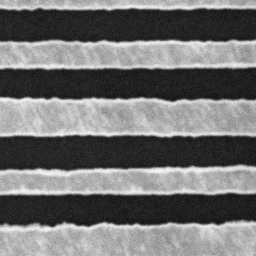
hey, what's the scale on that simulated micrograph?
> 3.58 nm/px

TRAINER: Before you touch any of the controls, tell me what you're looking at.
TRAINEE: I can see lines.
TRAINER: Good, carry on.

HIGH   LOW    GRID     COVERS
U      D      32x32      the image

UUUUUUUUUUUUUUUUUUUUUUUUUUUUUUUU
DDDDDDDDDDDDDDDDDDDDDDDDDDDDDDDD
DDDDDDDDDDDDDDDDDDDDDDDDDDDDDDDD
DDDDDDDDDDDDDDDDDDDDDDDDDDDDDDDD
DDDDDDDDDDDDDDDDDDDDDDDDDDDDDDDD
UUUUUUUUUUUUUUUUUUUUUUUUUUUUUUUU
UUUUUUUUUUUUUUUUUUUUUUUUUUUUUUUU
UUUUUUUUUUUUUUUUUUUUUUUUUUUUUUUU
DDDDDDDDDDDDDDDDDDDDDDDDDDDDDDDD
DDDDDDDDDDDDDDDDDDDDDDDDDDDDDDDD
DDDDDDDDDDDDDDDDDDDDDDDDDDDDDDDD
DDDDDDDDDDDDDDDDDDDDDDDDDDDDDDDD
UUUUUUUUUUUUUUUUUUUUDDUUUUUDUDUD
UUUUUUUUUUUUUUUUUUUUUUUUUUUUUUUU
UUUUUUUUUUUUUUUUUUUUUUUUUUUUUUUU
UUUUUUUUUUUUUUUUUUUUUUUUUUUUUUUU
UUUUUUUUUUUUUUUUUUUUUUUUUUUUUUUU
DDDDDDDDDDDDDDDDDDDDDDDDDDDDDDDD
DDDDDDDDDDDDDDDDDDDDDDDDDDDDDDDD
DDDDDDDDDDDDDDDDDDDDDDDDDDDDDDDD
DDDDDDDDDDDDDDDDDDDDDDDDDDDDDDDD
UUUUUUUUDUUUUUUUUUUUUUUUUUUUUUUU
UUUUUUUUUUUUUUUUUUUUUUUUUUUUUUUU
UUUUUUUUUUUUUUUUUUUUUUUUUUUUUUUU
DDDDDDDDDDDDDDDDDDDDDDDDDDDDDDDD
DDDDDDDDDDDDDDDDDDDDDDDDDDDDDDDD
DDDDDDDDDDDDDDDDDDDDDDDDDDDDDDDD
DDDDDDDDDDDDDDDDDDDDDDDDDDDDDDDD
DUDDUUUUUUUUUUUUUUUUUUUUUUUUUUUU
UUUUUUUUUUUUUUUUUUUUUUUUUUUUUUUU
UUUUUUUUUUUUUUUUUUUUUUUUUUUUUUUU
UUUUUUUUUUUUUUUUUUUUUUUUUUUUUUUU